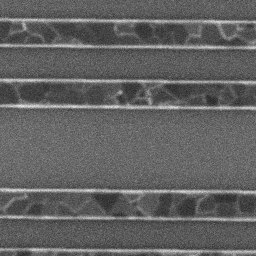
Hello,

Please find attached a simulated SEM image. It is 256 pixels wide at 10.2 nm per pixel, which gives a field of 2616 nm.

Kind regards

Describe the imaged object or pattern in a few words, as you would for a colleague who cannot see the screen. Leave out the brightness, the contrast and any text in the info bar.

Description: wiring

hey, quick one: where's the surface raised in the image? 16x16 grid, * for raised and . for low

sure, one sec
................
****************
****************
................
................
****************
****************
................
................
................
................
................
****************
****************
................
................